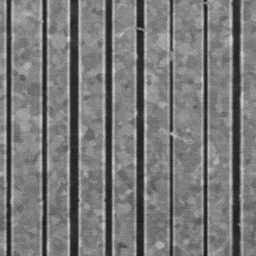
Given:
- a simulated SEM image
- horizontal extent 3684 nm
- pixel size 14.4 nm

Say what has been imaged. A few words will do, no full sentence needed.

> parallel lines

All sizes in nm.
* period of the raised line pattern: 462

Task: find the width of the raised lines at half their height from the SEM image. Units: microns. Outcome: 0.329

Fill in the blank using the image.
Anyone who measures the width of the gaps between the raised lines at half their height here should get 8.88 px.